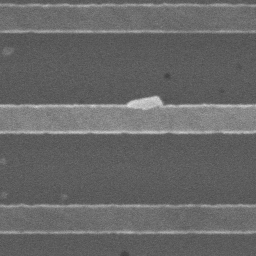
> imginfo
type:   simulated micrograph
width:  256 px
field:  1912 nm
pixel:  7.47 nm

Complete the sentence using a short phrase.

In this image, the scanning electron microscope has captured lines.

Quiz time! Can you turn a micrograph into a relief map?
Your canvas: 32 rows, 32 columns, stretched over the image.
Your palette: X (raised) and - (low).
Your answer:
--------------------------------
XXXXXXXXXXXXXXXXXXXXXXXXXXXXXXXX
XXXXXXXXXXXXXXXXXXXXXXXXXXXXXXXX
XXXXXXXXXXXXXXXXXXXXXXXXXXXXXXXX
--------------------------------
--------------------------------
--------------------------------
--------------------------------
--------------------------------
--------------------------------
--------------------------------
--------------------------------
-----------------XXX------------
XXXXXXXXXXXXXXXXXXXXXXXXXXXXXXXX
XXXXXXXXXXXXXXXXXXXXXXXXXXXXXXXX
XXXXXXXXXXXXXXXXXXXXXXXXXXXXXXXX
XXXXXXXXXXXXXXX-XXXXXXXXXXXXXXXX
--------------------------------
--------------------------------
--------------------------------
--------------------------------
--------------------------------
--------------------------------
--------------------------------
--------------------------------
--------------------------------
XXXXXXXXXXXXXXXXXXXXXXXXXXXXXXXX
XXXXXXXXXXXXXXXXXXXXXXXXXXXXXXXX
XXXXXXXXXXXXXXXXXXXXXXXXXXXXXXXX
--------------------------------
--------------------------------
--------------------------------